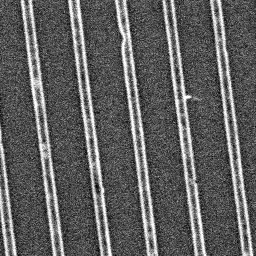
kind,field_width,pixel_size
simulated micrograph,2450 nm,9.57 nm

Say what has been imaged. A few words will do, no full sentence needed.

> parallel lines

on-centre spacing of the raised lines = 448 nanometres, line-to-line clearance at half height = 363 nanometres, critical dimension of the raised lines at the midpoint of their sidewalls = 87.8 nm